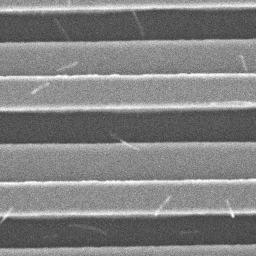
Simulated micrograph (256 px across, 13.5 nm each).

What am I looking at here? lines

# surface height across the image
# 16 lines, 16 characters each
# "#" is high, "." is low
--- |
###########.....
................
............####
################
################
################
################
................
................
################
################
################
################
#...............
................
...#############